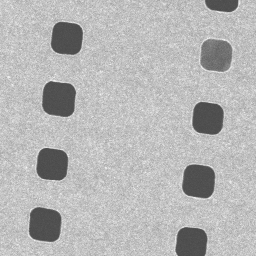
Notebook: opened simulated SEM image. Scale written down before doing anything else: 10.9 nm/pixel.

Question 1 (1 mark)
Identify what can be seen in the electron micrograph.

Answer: holes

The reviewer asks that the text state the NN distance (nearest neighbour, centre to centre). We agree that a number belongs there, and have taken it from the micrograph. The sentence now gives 665 nanometres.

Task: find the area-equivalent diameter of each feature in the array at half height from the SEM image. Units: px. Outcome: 34.2